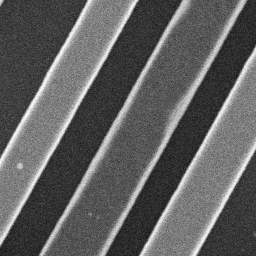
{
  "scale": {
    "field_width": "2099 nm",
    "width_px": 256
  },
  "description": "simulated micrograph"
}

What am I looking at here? lines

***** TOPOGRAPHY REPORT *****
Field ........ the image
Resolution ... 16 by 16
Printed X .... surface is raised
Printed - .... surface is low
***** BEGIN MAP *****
-----XXX---XXXX-
-----XXX---XXXX-
----XXX---XXXX--
----XXX--XXXX---
---XXX---XXXX--X
--XXXX--XXXX---X
--XXX---XXXX--XX
-XXX---XXXX--XXX
-XXX---XXXX--XXX
XXX---XXXX--XXXX
XXX---XXXX--XXX-
XX---XXXX--XXXX-
XX--XXXX---XXX--
X---XXXX--XXXX--
X--XXXX---XXX---
---XXXX--XXXX---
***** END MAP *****